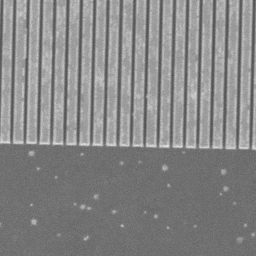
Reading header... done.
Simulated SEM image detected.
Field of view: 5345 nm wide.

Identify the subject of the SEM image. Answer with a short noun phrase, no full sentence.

parallel lines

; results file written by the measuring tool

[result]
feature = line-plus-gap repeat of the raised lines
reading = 13.3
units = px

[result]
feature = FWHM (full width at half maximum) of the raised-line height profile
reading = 0.201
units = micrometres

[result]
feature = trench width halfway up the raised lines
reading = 80.9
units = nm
